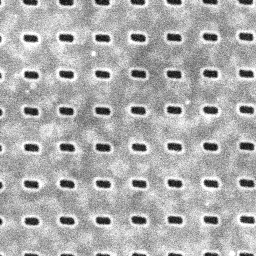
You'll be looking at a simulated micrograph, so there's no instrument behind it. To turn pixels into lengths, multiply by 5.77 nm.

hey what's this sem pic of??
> a regular array of holes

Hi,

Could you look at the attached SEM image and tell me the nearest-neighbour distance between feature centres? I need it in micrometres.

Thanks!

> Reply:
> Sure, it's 0.205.